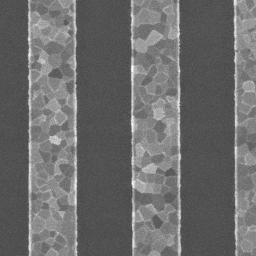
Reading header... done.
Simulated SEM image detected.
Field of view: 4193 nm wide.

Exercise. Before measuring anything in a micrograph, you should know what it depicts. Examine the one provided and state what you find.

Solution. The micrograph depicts lines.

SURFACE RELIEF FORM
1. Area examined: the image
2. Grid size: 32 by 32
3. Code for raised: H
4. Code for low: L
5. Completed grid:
LLLLHHHHHLLLLLLLLHHHHHLLLLLLLHHH
LLLLHHHHHLLLLLLLLHHHHHLLLLLLLHHH
LLLLHHHHHLLLLLLLLHHHHHLLLLLLLHHH
LLLLHHHHHLLLLLLLLHHHHHLLLLLLLHHH
LLLLHHHHHLLLLLLLLHHHHHLLLLLLLHHH
LLLLHHHHHLLLLLLLLHHHHHLLLLLLLHHH
LLLLHHHHHLLLLLLLLHHHHHLLLLLLLHHH
LLLLHHHHHLLLLLLLLHHHHHLLLLLLLHHH
LLLLHHHHHLLLLLLLLHHHHHLLLLLLLHHH
LLLLHHHHHLLLLLLLLHHHHHLLLLLLLHHH
LLLLHHHHHLLLLLLLLHHHHHLLLLLLLHHH
LLLLHHHHHLLLLLLLLHHHHHLLLLLLLHHH
LLLLHHHHHLLLLLLLLHHHHHLLLLLLLHHH
LLLLHHHHHLLLLLLLLHHHHHLLLLLLLHHH
LLLLHHHHHLLLLLLLLHHHHHLLLLLLLHHH
LLLLHHHHHLLLLLLLLHHHHHLLLLLLLHHH
LLLLHHHHHLLLLLLLLHHHHHLLLLLLLHHH
LLLLHHHHHLLLLLLLLHHHHHLLLLLLLHHH
LLLLHHHHHLLLLLLLLHHHHHLLLLLLLHHH
LLLLHHHHHLLLLLLLLHHHHHLLLLLLLHHH
LLLLHHHHHLLLLLLLLHHHHHLLLLLLLHHH
LLLLHHHHHLLLLLLLLHHHHHLLLLLLLHHH
LLLLHHHHHLLLLLLLLHHHHHLLLLLLLHHH
LLLLHHHHHLLLLLLLLHHHHHLLLLLLLHHH
LLLLHHHHHLLLLLLLLHHHHHLLLLLLLHHH
LLLLHHHHHLLLLLLLLHHHHHLLLLLLLHHH
LLLLHHHHHLLLLLLLLHHHHHLLLLLLLLHH
LLLLHHHHHLLLLLLLLHHHHHLLLLLLLLHH
LLLLHHHHHLLLLLLLLHHHHHLLLLLLLLHH
LLLLHHHHHLLLLLLLLHHHHHLLLLLLLLHH
LLLLHHHHHLLLLLLLLHHHHHLLLLLLLLHH
LLLLHHHHHLLLLLLLLHHHHHLLLLLLLLHH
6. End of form